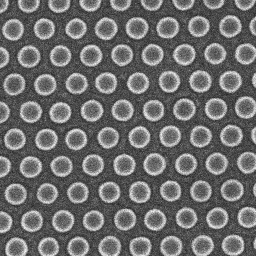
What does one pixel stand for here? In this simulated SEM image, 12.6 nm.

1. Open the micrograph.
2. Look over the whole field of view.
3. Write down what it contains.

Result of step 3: a regular array of raised bodies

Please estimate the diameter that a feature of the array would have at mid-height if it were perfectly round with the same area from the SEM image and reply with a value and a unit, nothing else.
256 nm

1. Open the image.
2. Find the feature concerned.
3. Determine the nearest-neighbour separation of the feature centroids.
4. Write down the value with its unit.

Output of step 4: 0.385 micrometres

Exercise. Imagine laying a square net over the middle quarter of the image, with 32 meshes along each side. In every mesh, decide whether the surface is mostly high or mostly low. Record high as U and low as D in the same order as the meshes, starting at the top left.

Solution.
DDDDDDDDDDDDDDDDDDDDDDDDDDDDDDDD
DDDDDDDDDDDDDDDDDDDDDDDDDDDDDDDD
DDDDDDDDDDUUDDDDDDUDDDDDDUUUDDDD
DUUUUDDDUUUUUDDDUUUUUDDDUUUUUDDD
DUUUUUDDUUUUUDDDUUUUUDDDUUUUUDDD
DUUUUUDDUUUUUDDDUUUUUDDDUUUUDDDD
DUUUUDDDDUUUDDDDDUUUDDDDDUUUDDDD
DDDDDDDDDDDDDDDDDDDDDDDDDDDDDDDD
DDDDDDDDDDDDDDDDDDDDDDDDDDDDDDDD
DDDDDDUUDDDDDUUUDDDDDUUUDDDDUUUU
UDDDDUUUUDDDUUUUUDDDUUUUUDDDUUUU
UDDDDUUUUUDDUUUUUDDDUUUUUDDDUUUU
UUDDDUUUUDDDUUUUUDDDUUUUUDDDUUUU
UDDDDUUUUDDDDUUUDDDDDUUUDDDDDUUD
DDDDDDDDDDDDDDDDDDDDDDDDDDDDDDDD
DDDDDDDDDDDDDDDDDDDDDDDDDDDDDDDD
DDDDDDDDDDUUUDDDDUUUUDDDDUUUUDDD
DUUUUDDDDUUUUDDDUUUUUDDDUUUUUDDD
DUUUUUDDDUUUUDDDUUUUUDDDUUUUUDDD
DUUUUDDDDUUUUDDDDUUUUDDDUUUUDDDD
DUUUUDDDDDUUDDDDDDUUDDDDDDUDDDDD
DDDDDDDDDDDDDDDDDDDDDDDDDDDDDDDD
DDDDDDDDDDDDDDDDDDDDDDDDDDDDDDDD
UDDDDDUUUDDDDUUUUDDDDUUUUDDDDUUU
UUDDDUUUUUDDDUUUUDDDUUUUUDDDUUUU
UUDDDUUUUUDDDUUUUUDDUUUUUDDDUUUU
UUDDDUUUUDDDDUUUUDDDUUUUUDDDUUUU
UDDDDDUUDDDDDDUUDDDDDDUDDDDDDDUD
DDDDDDDDDDDDDDDDDDDDDDDDDDDDDDDD
DDDDDDDDDDDDDDDDDDDDDDDDDDUDDDDD
DDUUUDDDDUUUUDDDDUUUUDDDDUUUUDDD
DUUUUUDDDUUUUUDDDUUUUDDDUUUUUDDD